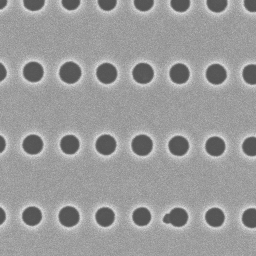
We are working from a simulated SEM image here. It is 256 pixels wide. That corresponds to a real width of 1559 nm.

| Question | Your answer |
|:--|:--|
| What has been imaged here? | a regular array of holes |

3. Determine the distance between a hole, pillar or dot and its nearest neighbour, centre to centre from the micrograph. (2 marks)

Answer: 0.222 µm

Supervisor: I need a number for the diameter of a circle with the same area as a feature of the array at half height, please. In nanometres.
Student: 124